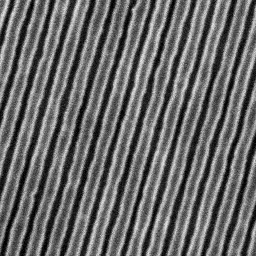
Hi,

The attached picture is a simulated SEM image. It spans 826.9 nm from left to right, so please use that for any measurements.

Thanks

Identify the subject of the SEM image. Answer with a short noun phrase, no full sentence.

parallel lines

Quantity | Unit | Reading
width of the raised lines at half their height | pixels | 11.9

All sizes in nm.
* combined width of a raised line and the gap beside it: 62.7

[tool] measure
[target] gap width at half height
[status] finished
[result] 0.0226 µm